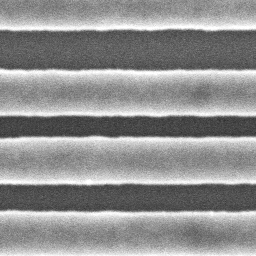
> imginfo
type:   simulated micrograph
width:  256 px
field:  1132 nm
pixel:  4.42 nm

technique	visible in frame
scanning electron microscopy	lines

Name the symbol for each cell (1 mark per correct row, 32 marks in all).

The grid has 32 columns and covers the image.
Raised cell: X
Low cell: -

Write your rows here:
XXXXXXXXXXXXXXXXXXXXXXXXXXXXXXXX
XXXXXXXXXXXXXXXXXXXXXXXXXXXXXXXX
XXXXXXXXXXXXXXXXXXXXXXXXXXXXXXXX
XXXXXXXXXXXXXXXXXXXXXXXXXXXXXXXX
--------------------------------
--------------------------------
--------------------------------
--------------------------------
--------------------------------
XXXXXXXXXXXXXXXXXXXXXXXXXXXXXXXX
XXXXXXXXXXXXXXXXXXXXXXXXXXXXXXXX
XXXXXXXXXXXXXXXXXXXXXXXXXXXXXXXX
XXXXXXXXXXXXXXXXXXXXXXXXXXXXXXXX
XXXXXXXXXXXXXXXXXXXXXXXXXXXXXXXX
--------------------------------
--------------------------------
--------------------------------
XXXXXXXXXXXXXXXXXXXXXXXXXXXXXXXX
XXXXXXXXXXXXXXXXXXXXXXXXXXXXXXXX
XXXXXXXXXXXXXXXXXXXXXXXXXXXXXXXX
XXXXXXXXXXXXXXXXXXXXXXXXXXXXXXXX
XXXXXXXXXXXXXXXXXXXXXXXXXXXXXXXX
XXXXXXXXXXXXXXXXXXXXXXXXXXXXXXXX
--------------------------------
--------------------------------
--------------------------------
XXXX--X------X------------X----X
XXXXXXXXXXXXXXXXXXXXXXXXXXXXXXXX
XXXXXXXXXXXXXXXXXXXXXXXXXXXXXXXX
XXXXXXXXXXXXXXXXXXXXXXXXXXXXXXXX
XXXXXXXXXXXXXXXXXXXXXXXXXXXXXXXX
XXXXXXXXXXXXXXXXXXXXXXXXXXXXXXXX